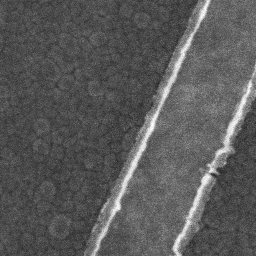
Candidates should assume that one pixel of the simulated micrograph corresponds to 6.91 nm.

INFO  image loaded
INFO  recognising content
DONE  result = one or a few lines or trenches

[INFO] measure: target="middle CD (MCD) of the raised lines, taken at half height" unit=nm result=504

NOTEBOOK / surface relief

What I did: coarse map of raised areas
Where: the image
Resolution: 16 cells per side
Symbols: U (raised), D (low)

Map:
DDDDDDDDDDDDDUUU
DDDDDDDDDDDDUUUU
DDDDDDDDDDDDUUUU
DDDDDDDDDDDUUUUU
DDDDDDDDDDDUUUUU
DDDDDDDDDDUUUUUU
DDDDDDDDDDUUUUUD
DDDDDDDDDDUUUUUD
DDDDDDDDDUUUUUDD
DDDDDDDDDUUUUUDD
DDDDDDDDUUUUUDDD
DDDDDDDDUUUUUDDD
DDDDDDDUUUUUDDDD
DDDDDDDUUUUUDDDD
DDDDDDUUUUUDDDDD
DDDDDDUUUUUDDDDD